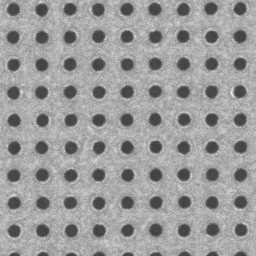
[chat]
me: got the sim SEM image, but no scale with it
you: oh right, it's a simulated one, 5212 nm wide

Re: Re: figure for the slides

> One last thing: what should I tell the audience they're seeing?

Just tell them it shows a regular array of holes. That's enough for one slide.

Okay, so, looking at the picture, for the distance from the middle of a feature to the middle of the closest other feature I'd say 0.557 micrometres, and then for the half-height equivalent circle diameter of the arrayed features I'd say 0.283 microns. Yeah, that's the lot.